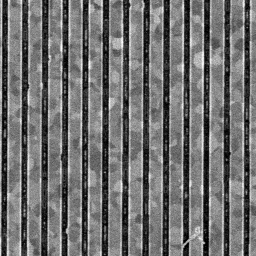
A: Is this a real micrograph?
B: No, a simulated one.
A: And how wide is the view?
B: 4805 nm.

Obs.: parallel lines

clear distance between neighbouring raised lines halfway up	141	nm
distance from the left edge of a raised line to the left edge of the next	379	nm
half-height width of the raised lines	0.249	um